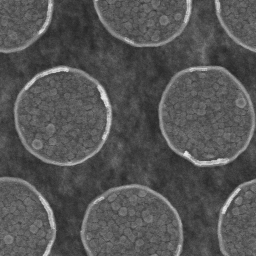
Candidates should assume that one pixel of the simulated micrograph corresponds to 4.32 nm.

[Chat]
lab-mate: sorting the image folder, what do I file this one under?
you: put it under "raised bodies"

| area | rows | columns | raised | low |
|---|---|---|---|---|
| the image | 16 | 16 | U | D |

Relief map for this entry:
UUUDDDUUUUUUDDUU
UUUDDDDUUUUUDDUU
UUDDDDDDUUUDDDDU
DDDDDDDDDDDDDDDD
DDDUUDDDDDDUUUDD
DDUUUUDDDDUUUUUD
DUUUUUUDDDUUUUUU
DUUUUUUDDDUUUUUU
DUUUUUUDDDUUUUUU
DDUUUUDDDDDUUUUD
DDDDDDDDDDDDDDDD
UUDDDDDDDDDDDDDU
UUUDDDUUUUDDDDUU
UUUDDUUUUUUDDDUU
UUUDDUUUUUUDDDUU
UUUDDUUUUUUDDDUU